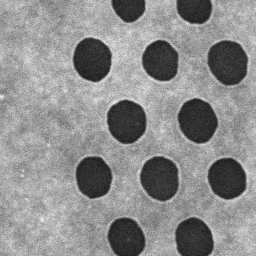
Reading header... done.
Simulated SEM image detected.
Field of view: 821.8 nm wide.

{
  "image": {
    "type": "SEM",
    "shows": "a regular array of holes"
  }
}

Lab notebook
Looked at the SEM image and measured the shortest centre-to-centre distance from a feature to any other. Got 209 nm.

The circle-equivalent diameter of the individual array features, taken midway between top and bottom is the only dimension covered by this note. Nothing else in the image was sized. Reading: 0.136 um